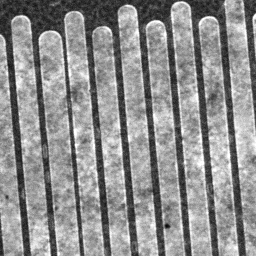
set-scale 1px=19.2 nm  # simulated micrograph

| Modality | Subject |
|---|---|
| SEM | parallel lines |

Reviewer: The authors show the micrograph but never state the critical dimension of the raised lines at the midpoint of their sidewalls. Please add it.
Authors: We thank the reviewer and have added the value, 359 nanometers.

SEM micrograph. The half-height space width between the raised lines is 151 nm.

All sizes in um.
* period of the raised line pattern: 0.515